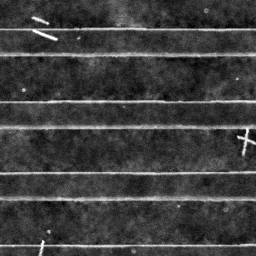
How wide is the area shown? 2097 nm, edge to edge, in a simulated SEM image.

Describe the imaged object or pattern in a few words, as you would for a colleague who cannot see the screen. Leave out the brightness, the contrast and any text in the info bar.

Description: lines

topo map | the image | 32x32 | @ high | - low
--------------------------------
--------------------------------
--------------------------------
--------------------------------
@@@@@@@@@@@@@@@@@@@@@@@@@@@@@@@@
@@@@@@@@@@@@@@@@@@@@@@@@@@@@@@@@
@@@@@@@@@@@@@@@@@@@@@@@@@@@@@@@@
--------------------------------
--------------------------------
--------------------------------
--------------------------------
--------------------------------
--------------------------------
@@@@@@@@@@@@@@@@@@@@@@@@@@@@@@@@
@@@@@@@@@@@@@@@@@@@@@@@@@@@@@@@@
@@@@@@@@@@@@@@@@@@@@@@@@@@@@@@@@
--------------------------------
--------------------------------
--------------------------------
--------------------------------
--------------------------------
--------------------------------
@@@@@@@@@@@@@@@@@@@@@@@@@@@@@@@@
@@@@@@@@@@@@@@@@@@@@@@@@@@@@@@@@
@@@@@@@@@@@@@@@@@@@@@@@@@@@@@@@@
--------------------------------
--------------------------------
--------------------------------
--------------------------------
--------------------------------
-----@--------------------------
@@@@@@@@@@@@@@@@@@@@@@@@@@@@@@@@